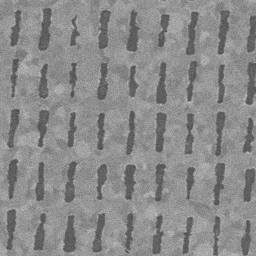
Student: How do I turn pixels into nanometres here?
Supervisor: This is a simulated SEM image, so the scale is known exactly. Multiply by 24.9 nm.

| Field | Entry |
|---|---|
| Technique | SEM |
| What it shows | a regular array of holes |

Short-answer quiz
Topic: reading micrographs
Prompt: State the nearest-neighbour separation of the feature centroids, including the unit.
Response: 730 nanometres